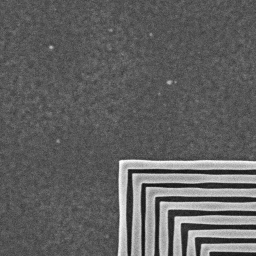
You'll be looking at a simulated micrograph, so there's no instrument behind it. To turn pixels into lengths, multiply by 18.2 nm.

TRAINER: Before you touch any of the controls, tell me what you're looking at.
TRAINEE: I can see groups of lines, slits or small figures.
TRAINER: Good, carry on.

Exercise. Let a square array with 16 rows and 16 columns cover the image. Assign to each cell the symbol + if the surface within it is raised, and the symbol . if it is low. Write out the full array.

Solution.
................
................
................
................
................
................
................
................
................
................
........++++++++
........++++++++
.........+++++++
........+++.++++
........+++...++
.......+++++++++